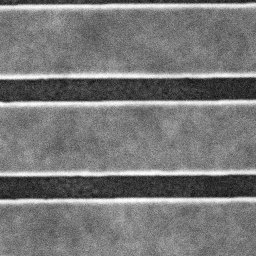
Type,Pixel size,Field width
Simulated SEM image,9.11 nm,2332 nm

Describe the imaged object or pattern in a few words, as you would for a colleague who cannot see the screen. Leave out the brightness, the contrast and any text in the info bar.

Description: lines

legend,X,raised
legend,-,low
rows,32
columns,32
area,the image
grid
--------------------------------
XXXXXXXXXXXXXXXXXXXXXXXXXXXXXXXX
XXXXXXXXXXXXXXXXXXXXXXXXXXXXXXXX
XXXXXXXXXXXXXXXXXXXXXXXXXXXXXXXX
XXXXXXXXXXXXXXXXXXXXXXXXXXXXXXXX
XXXXXXXXXXXXXXXXXXXXXXXXXXXXXXXX
XXXXXXXXXXXXXXXXXXXXXXXXXXXXXXXX
XXXXXXXXXXXXXXXXXXXXXXXXXXXXXXXX
XXXXXXXXXXXXXXXXXXXXXXXXXXXXXXXX
XXXXXXXXXXXXXXXXXXXXXXXXXXXXXXXX
--------------------------------
--------------------------------
--------------------------------
XXXXXXXXXXXXXXXXXXXXXXXXXXXXXXXX
XXXXXXXXXXXXXXXXXXXXXXXXXXXXXXXX
XXXXXXXXXXXXXXXXXXXXXXXXXXXXXXXX
XXXXXXXXXXXXXXXXXXXXXXXXXXXXXXXX
XXXXXXXXXXXXXXXXXXXXXXXXXXXXXXXX
XXXXXXXXXXXXXXXXXXXXXXXXXXXXXXXX
XXXXXXXXXXXXXXXXXXXXXXXXXXXXXXXX
XXXXXXXXXXXXXXXXXXXXXXXXXXXXXXXX
XXXXXXXXXXXXXXXXXXXXXXXXXXXXXXXX
--------------------------------
--------------------------------
--------------------------------
XXXXXXXXXXXXXXXXXXXXXXXXXXXXXXXX
XXXXXXXXXXXXXXXXXXXXXXXXXXXXXXXX
XXXXXXXXXXXXXXXXXXXXXXXXXXXXXXXX
XXXXXXXXXXXXXXXXXXXXXXXXXXXXXXXX
XXXXXXXXXXXXXXXXXXXXXXXXXXXXXXXX
XXXXXXXXXXXXXXXXXXXXXXXXXXXXXXXX
XXXXXXXXXXXXXXXXXXXXXXXXXXXXXXXX